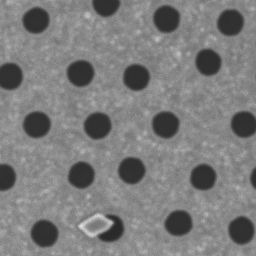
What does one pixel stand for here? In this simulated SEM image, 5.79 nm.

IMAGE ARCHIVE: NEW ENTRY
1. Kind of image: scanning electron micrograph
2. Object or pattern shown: a regular array of holes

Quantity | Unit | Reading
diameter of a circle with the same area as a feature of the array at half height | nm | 155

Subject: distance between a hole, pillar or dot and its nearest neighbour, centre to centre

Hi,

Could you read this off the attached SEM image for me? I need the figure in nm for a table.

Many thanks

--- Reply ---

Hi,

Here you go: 322